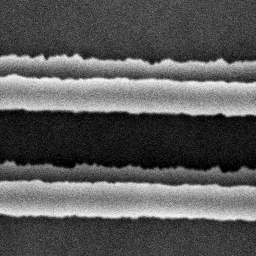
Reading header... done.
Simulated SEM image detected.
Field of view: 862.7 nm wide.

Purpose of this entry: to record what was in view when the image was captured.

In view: lines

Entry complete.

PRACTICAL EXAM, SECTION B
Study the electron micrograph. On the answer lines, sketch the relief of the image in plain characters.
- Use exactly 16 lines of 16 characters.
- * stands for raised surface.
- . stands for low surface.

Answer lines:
................
................
................
................
................
****************
****************
................
................
................
................
**********......
****************
......**..******
................
................